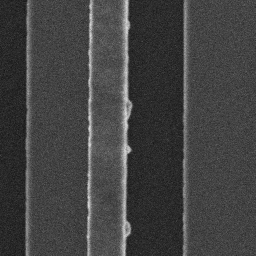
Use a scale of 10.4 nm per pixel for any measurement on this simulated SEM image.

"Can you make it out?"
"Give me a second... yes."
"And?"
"lines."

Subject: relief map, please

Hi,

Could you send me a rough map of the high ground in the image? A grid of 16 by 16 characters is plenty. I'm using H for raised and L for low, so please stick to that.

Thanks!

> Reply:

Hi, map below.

LLHHHHHHLLLLHHHH
LLHHHHHHLLLLHHHH
LLHHHHHHLLLLHHHH
LLHHHHHHLLLLHHHH
LLHHHHHHLLLLHHHH
LLHHHHHHLLLLHHHH
LLHHHHHHLLLLHHHH
LLHHHHHHLLLLHHHH
LLHHHHHHLLLLHHHH
LLHHHHHHLLLLHHHH
LLHHHHHHLLLLHHHH
LLHHHHHHLLLLHHHH
LLHHHHHHLLLLHHHH
LLHHHHHHLLLHHHHH
LLHHHHHHLLLLHHHH
LLHHHHHHLLLLHHHH